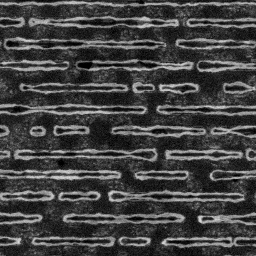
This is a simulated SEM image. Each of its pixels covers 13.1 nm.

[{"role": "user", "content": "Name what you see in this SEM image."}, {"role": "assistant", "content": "parallel lines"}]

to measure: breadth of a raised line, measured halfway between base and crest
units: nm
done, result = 86.7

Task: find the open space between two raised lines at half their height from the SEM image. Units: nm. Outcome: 201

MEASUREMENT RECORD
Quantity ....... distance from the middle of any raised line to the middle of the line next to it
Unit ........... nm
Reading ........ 287